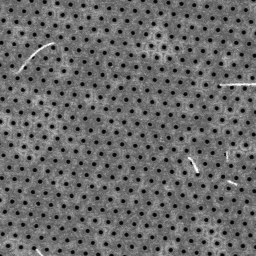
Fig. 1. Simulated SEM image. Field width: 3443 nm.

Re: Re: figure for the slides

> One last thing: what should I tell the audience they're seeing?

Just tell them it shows a regular array of holes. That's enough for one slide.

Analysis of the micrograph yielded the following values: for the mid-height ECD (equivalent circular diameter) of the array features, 4.37 px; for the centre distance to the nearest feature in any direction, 169 nanometres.